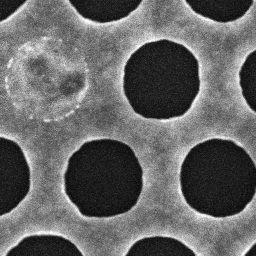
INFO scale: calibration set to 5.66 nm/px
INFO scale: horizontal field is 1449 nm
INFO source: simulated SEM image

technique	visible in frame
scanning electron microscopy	holes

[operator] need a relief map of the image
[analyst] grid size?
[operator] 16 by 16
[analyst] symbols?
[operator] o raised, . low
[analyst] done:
.oooo....ooo....
oooooooooooooooo
oooooooooooooooo
oooooooo....oooo
oooooooo....ooo.
oooooooo....ooo.
oooooooo....ooo.
oooooooooooooooo
oooooooooooooooo
.oooo...oooo...o
..oo.....oo.....
..oo.....oo.....
.ooo.....ooo....
ooooo..oooooo.oo
oooooooooooooooo
o....ooo....oooo